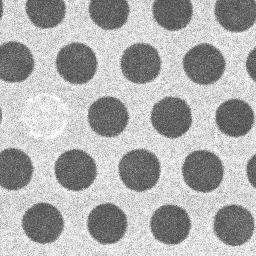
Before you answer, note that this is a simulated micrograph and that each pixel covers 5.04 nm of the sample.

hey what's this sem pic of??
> a regular array of holes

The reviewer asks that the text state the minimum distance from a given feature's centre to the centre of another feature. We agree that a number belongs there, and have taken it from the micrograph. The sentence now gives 312 nm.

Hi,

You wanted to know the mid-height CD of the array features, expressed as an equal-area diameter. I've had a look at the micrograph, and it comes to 0.212 microns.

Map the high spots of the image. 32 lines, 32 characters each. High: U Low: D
UUUDDDDDUUUDDDDDUUUDDDDDUUUDDDDD
UUUDDDDDUUUDDDDDUUUDDDDDUUUDDDDD
UUUUDDDDUUUDDDDDUUUDDDDDUUUDDDDD
UUUUUDUUUUUUUDDUUUUUDDDUUUUUDDDU
UUUUUUUUUUUUUUUUUUUUUUUUUUUUUUUU
DDDUUUUUUDUUUUUUUDUUUUUUUDUUUUUU
DDDDUUUDDDDDUUUDDDDDUUUDDDDDUUUD
DDDDUUUDDDDDUUUDDDDDUUUDDDDDUUUD
DDDDUUUDDDDDUUUDDDDDUUUDDDDDUUUD
DDDDUUUUDDDDUUUUDDDDUUUDDDDDUUUD
UUUUUUUUUDUUUUUUUDUUUUUUUDDUUUUU
UUUUUUUUUUUUUUUUUUUUUUUUUUUUUUUU
UUUUUUUUUUUUDDDUUUUUDDDUUUUUDDUU
UUUUUUUUUUUDDDDDUUUDDDDDUUUDDDDU
UUUUUUUUUUUDDDDDUUUDDDDDUUUDDDDD
UUUUUUUUUUUDDDDDUUUDDDDDUUUDDDDD
UUUUUUUUUUUUDDDUUUUUDDDUUUUUDDDU
UUUUUUUUUUUUUUUUUUUUUUUUUUUUUUUU
UDUUUUUUUUUUUUUUUUUUUUUUUUUUUUUU
DDDDUUUDDDDUUUUDDDDDUUUDDDDUUUUD
DDDDUUUDDDDDUUUDDDDDUUUDDDDDUUUD
DDDDUUUDDDDDUUUDDDDDUUUDDDDDUUUD
DDDDUUUDDDDDUUUDDDDDUUUDDDDDUUUD
DDDUUUUUDDDUUUUUDDDUUUUUDDDUUUUU
UUUUUUUUUUUUUUUUUUUUUUUUUUUUUUUU
UUUUDDUUUUUUUDUUUUUUUUUUUUUUUUUU
UUUDDDDDUUUDDDDUUUUDDDDUUUUDDDDU
UUUDDDDDUUUDDDDDUUUDDDDDUUUDDDDD
UUUDDDDDUUUDDDDDUUUDDDDDUUUDDDDD
UUUDDDDUUUUDDDDUUUUDDDDUUUUDDDDD
UUUUUDUUUUUUUDUUUUUUUDUUUUUUDDUU
UUUUUUUUUUUUUUUUUUUUUUUUUUUUUUUU